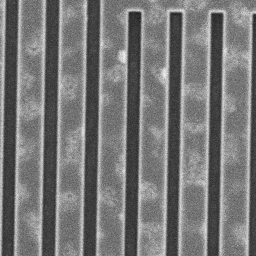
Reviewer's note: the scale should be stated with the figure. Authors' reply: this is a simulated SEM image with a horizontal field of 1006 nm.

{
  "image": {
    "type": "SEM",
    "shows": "parallel lines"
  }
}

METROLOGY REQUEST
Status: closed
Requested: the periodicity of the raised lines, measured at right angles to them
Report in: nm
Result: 162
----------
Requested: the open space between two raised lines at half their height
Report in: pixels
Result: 13.9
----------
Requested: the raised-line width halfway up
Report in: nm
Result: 109